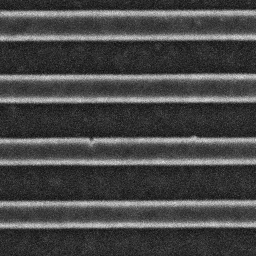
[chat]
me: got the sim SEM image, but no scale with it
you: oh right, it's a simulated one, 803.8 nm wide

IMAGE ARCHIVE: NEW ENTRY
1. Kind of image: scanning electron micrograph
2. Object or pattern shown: one or a few lines or trenches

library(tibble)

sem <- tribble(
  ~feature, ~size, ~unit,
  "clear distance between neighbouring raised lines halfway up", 0.125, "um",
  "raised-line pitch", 198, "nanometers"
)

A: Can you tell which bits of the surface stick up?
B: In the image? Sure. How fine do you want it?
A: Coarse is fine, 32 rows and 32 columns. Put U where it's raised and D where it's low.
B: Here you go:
DDDDDDDDDDDDDDDDDDDDDDDDDDDDDDDD
DDDDDDDDDDDDDDDDDDDDDDDDDDDDDDDD
UUUUUUUUUUUUUUUUUUUUUUUUUUUUUUUU
UUUUUUUUUUUUUUUUUUUUUUUUUUUUUUUU
UUUUUUUUUUUUUUUUUUUUUUUUUUUUUUUU
DDDDDDDDDDDDDDDDDDDDDDDDDDDDDDDD
DDDDDDDDDDDDDDDDDDDDDDDDDDDDDDDD
DDDDDDDDDDDDDDDDDDDDDDDDDDDDDDDD
DDDDDDDDDDDDDDDDDDDDDDDDDDDDDDDD
DDDDDDDDDDDDDDDDDDDDDDDDDDDDDDDD
UUUUUUUUUUUUUUUUUUUUUUUUUUUUUUUU
UUUUUUUUUUUUUUUUUUUUUUUUUUUUUUUU
DDDDDDDDDDDDDDDDDDDDDDDDDDDDDDDD
DDDDDDDDDDDDDDDDDDDDDDDDDDDDDDDD
DDDDDDDDDDDDDDDDDDDDDDDDDDDDDDDD
DDDDDDDDDDDDDDDDDDDDDDDDDDDDDDDD
DDDDDDDDDDDDDDDDDDDDDDDDDDDDDDDD
DDDDDDDDDDDDDDDDDDDDDDDUUDDUUDDD
UUUUUUUUUUUUUUUUUUUUUUUUUUUUUUUU
UUUUUUUUUUUUUUUUUUUUUUUUUUUUUUUU
DDDDDDDDDDDDDDDDDDDDDDDDDDDDDDDD
DDDDDDDDDDDDDDDDDDDDDDDDDDDDDDDD
DDDDDDDDDDDDDDDDDDDDDDDDDDDDDDDD
DDDDDDDDDDDDDDDDDDDDDDDDDDDDDDDD
DDDDDDDDDDDDDDDDDDDDDDDDDDDDDDDD
DDDDDDDDDUUUUUUUUUUUUUUUUUUUUUUU
UUUUUUUUUUUUUUUUUUUUUUUUUUUUUUUU
UUUUUUUUUUUUUUUUUUUUUUUUUUUUUUUU
DDDDDDDDDDDDDDDDDDDDDDDDDDDDDDDD
DDDDDDDDDDDDDDDDDDDDDDDDDDDDDDDD
DDDDDDDDDDDDDDDDDDDDDDDDDDDDDDDD
DDDDDDDDDDDDDDDDDDDDDDDDDDDDDDDD